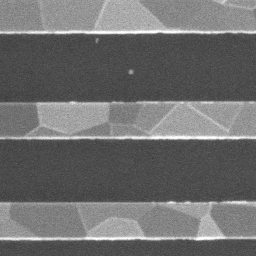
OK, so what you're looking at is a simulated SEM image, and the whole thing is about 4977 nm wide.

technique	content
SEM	lines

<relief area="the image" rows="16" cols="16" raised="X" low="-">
XXXXXXXXXXXXXXXX
XXXXXXXXXXXXXXXX
----------------
----------------
----------------
----------------
XXXXXXXXXXXXXXXX
XXXXXXXXXXXXXXXX
XXXXXXXXXXXXXXXX
----------------
----------------
----------------
----------------
XXXXXXXXXXXXXXXX
XXXXXXXXXXXXXXXX
----------------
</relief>